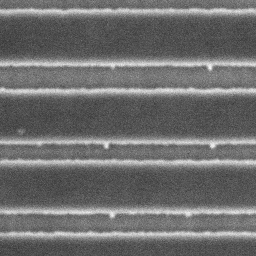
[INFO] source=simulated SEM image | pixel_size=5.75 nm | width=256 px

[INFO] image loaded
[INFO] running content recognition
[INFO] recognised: lines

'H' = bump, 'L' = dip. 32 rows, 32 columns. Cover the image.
LLLLLLLLLLLLLLLLLLLLLLLLLLLLLLLL
HHHHHHHHHHHHHHHHHHHHHHHHHHHHHHHH
HHHHHHHHHHHHHHHHHHHHHHHHHHHHHHHH
HHHHHHHHHHHHHHHHHHHHHHHHHHHHHHHH
HHHHHHHHHHHHHHHHHHHHHHHHHHHHHHHH
HHHHHHHHHHHHHHHHHHHHHHHHHHHHHHHH
HHHHHHHHHHHHHHHHHHHHHHHHHHHHHHHH
HHHHHHHHHHHHHHHHHHHHHHHHHHHHHHHH
LLLLLLLLLLLLLLLLLLLLLLLLLLLLLLLL
LLLLLLLLLLLLLLLLLLLLLLLLLLLLLLLL
LLLLLLLLLLLLLLLLLLLLLLLLLLLLLLLL
HHHHHHHHHHHHHHHHHHHHHHHHHHHHHHHH
HHHHHHHHHHHHHHHHHHHHHHHHHHHHHHHH
HHHHHHHHHHHHHHHHHHHHHHHHHHHHHHHH
HHHHHHHHHHHHHHHHHHHHHHHHHHHHHHHH
HHHHHHHHHHHHHHHHHHHHHHHHHHHHHHHH
HHHHHHHHHHHHHHHHHHHHHHHHHHHHHHHH
HHHHHHHHHHHHHHHHHHHHHHHHHHHHHHHH
LLLLLLLLLLLLLLLLLLLLLLLLLLLLLLLL
LLLLLLLLLLLLLLLLLLLLLLLLLLLLLLLL
HHHHHHHHHHHHHHHHHHHHHHHHHHHHHHHH
HHHHHHHHHHHHHHHHHHHHHHHHHHHHHHHH
HHHHHHHHHHHHHHHHHHHHHHHHHHHHHHHH
HHHHHHHHHHHHHHHHHHHHHHHHHHHHHHHH
HHHHHHHHHHHHHHHHHHHHHHHHHHHHHHHH
HHHHHHHHHHHHHHHHHHHHHHHHHHHHHHHH
HHHHHHHHHHHHHHHHHHHHHHHHHHHHHHHH
LLLLLLLLLLLLLLLLLLLLLLLLLLLLLLLL
LLLLLLLLLLLLLLLLLLLLLLLLLLLLLLLL
HHHHHHHHHHHHHHHHHHHHHHHHHHHHHHHH
HHHHHHHHHHHHHHHHHHHHHHHHHHHHHHHH
HHHHHHHHHHHHHHHHHHHHHHHHHHHHHHHH